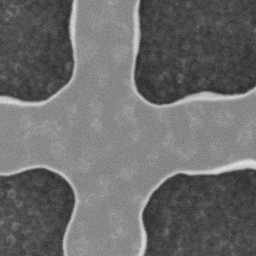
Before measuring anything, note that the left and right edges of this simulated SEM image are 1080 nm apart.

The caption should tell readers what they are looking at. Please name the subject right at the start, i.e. holes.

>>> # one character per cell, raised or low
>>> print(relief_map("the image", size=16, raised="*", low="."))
.....****.......
....*****.......
....*****.......
.....****.......
.....***........
....*****.......
****************
****************
****************
****************
****************
....******......
.....****.......
....*****.......
....*****.......
....*****.......